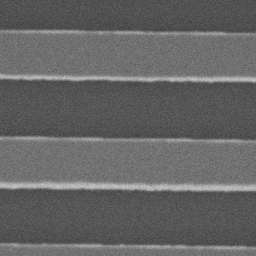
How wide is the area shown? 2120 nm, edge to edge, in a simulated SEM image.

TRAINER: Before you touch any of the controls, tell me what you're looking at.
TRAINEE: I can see lines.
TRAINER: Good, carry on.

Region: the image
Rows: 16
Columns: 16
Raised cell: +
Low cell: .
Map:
................
................
++++++++++++++++
++++++++++++++++
++++++++++++++++
................
................
................
................
++++++++++++++++
++++++++++++++++
++++++++++++++++
................
................
................
++++++++++++++++